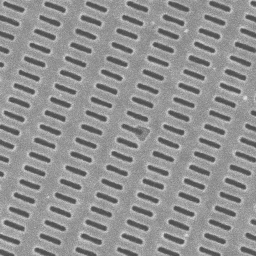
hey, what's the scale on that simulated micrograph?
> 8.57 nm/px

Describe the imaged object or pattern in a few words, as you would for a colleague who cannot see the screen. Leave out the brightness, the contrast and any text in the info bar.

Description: a regular array of holes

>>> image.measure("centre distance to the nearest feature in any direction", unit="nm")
122